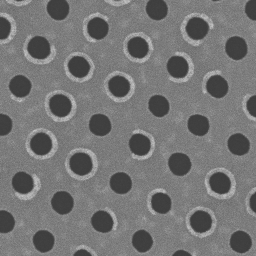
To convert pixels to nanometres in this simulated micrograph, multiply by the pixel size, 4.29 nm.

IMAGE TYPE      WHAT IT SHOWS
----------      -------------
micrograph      a regular array of holes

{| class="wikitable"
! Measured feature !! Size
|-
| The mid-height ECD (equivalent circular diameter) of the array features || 94.6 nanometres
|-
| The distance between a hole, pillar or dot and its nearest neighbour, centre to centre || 0.184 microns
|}